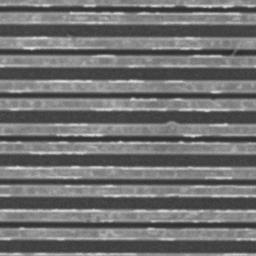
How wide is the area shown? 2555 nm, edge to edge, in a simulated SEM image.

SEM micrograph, parallel lines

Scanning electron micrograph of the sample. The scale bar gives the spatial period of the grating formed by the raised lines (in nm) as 215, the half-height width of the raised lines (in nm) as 112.